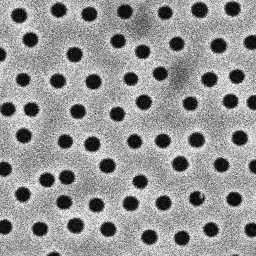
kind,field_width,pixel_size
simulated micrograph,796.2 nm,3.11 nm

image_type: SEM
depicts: a regular array of holes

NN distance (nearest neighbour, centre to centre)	88.5	nm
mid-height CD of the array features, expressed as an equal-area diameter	48	nm